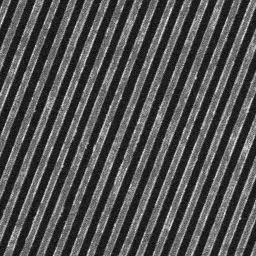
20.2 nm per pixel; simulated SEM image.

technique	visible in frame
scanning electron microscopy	parallel lines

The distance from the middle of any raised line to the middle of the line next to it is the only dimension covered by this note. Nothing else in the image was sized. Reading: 15.4 pixels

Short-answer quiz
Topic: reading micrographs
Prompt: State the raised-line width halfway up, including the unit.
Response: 139 nanometres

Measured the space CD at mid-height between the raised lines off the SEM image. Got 177 nm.